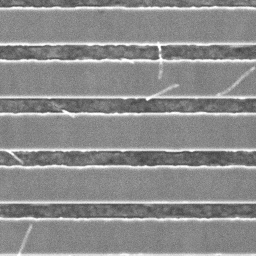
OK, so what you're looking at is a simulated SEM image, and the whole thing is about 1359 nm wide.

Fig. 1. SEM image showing lines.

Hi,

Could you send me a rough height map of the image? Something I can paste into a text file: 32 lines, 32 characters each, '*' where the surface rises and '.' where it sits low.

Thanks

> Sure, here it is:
................................
********************************
********************************
********************************
********************************
********************************
................................
.............*.*....*...........
********************************
********************************
********************************
********************************
................................
................................
********************************
********************************
********************************
********************************
********************************
................................
................................
********************************
********************************
********************************
********************************
................................
................................
********************************
********************************
********************************
********************************
********************************